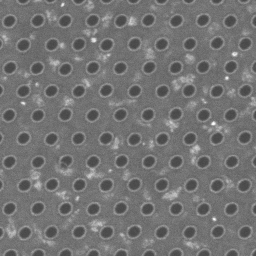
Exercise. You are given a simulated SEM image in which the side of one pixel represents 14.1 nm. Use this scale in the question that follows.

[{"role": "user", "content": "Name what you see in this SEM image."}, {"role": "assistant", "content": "a regular array of raised bodies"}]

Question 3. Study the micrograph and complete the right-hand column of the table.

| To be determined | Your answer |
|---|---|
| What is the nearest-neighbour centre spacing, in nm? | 376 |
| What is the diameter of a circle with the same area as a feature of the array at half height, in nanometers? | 184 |